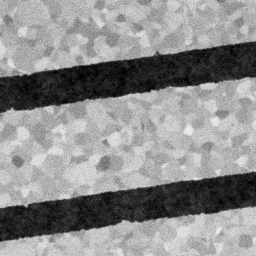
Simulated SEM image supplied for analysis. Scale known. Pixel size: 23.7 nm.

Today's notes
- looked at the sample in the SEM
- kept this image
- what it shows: one or a few lines or trenches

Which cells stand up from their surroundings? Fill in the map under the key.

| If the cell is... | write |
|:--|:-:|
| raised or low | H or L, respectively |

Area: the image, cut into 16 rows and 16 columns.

HHHHHHHHHHHHHHHH
HHHHHHHHHHHHHHHH
HHHHHHHHHHHHHHHH
HHHHHHHHHLLLLLLL
HHLLLLLLLLLLLLLL
LLLLLLLLLLHHHHHH
LLLLHHHHHHHHHHHH
HHHHHHHHHHHHHHHH
HHHHHHHHHHHHHHHH
HHHHHHHHHHHHHHHH
HHHHHHHHHHHHHHHH
HHHHHHHHHHLLLLLL
HHHLLLLLLLLLLLLL
LLLLLLLLLLLLHHHH
LLLLLHHHHHHHHHHH
HHHHHHHHHHHHHHHH